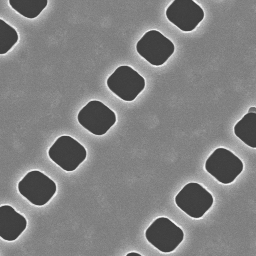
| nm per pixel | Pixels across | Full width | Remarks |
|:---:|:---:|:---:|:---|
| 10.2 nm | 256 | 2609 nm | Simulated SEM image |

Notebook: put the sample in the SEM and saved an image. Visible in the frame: a regular array of holes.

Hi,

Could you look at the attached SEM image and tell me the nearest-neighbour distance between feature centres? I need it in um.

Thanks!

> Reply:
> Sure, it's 0.465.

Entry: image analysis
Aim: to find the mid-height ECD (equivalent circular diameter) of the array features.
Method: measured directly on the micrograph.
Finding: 348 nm